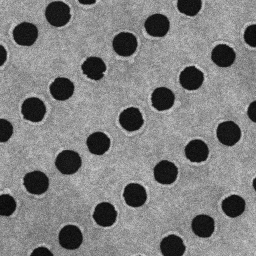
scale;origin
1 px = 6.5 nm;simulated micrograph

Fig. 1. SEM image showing a regular array of holes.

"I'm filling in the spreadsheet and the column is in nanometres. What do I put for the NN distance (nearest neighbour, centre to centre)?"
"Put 238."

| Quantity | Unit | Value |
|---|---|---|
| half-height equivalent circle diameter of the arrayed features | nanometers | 157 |